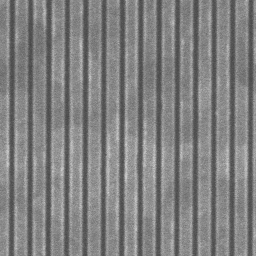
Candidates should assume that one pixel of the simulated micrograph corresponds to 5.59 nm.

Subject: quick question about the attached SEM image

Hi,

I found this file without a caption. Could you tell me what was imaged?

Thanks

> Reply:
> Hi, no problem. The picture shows parallel lines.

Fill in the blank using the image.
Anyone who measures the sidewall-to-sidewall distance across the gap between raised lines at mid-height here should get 0.0371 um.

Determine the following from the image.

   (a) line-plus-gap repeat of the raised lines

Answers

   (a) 103 nm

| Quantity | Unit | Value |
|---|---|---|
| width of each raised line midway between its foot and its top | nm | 63.6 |